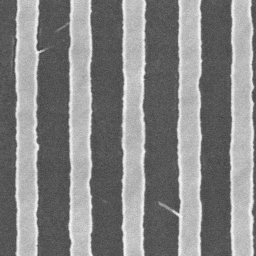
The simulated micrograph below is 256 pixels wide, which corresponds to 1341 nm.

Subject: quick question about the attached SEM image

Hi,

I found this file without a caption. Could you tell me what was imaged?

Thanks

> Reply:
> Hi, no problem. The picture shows lines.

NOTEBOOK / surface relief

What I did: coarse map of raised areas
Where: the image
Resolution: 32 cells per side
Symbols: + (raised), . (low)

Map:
..+++....++....+++....+++....++.
..+++....++....+++....+++....++.
..+++....++....+++....+++....++.
..+++....++....+++....+++....+++
..+++....++....+++....+++....+++
..+++....++....+++....+++....++.
..+++....++....+++....+++....+++
..+++....++....+++....+++....+++
..+++....++....+++....+++....+++
..+++....++....+++....+++....+++
..+++....++....+++....+++....+++
..+++....++....+++....+++....+++
..++.....++....+++....+++....+++
..+++....++....+++....+++....+++
..+++....++....+++....+++....+++
..+++....++....+++....+++....+++
..++.....++....+++....+++....+++
..+++....++....+++....+++....+++
..+++....++....+++....+++....+++
..+++....++....+++....+++....+++
..+++....++....+++....+++....+++
..+++....++....+++....+++....+++
..+++....++....+++....+++....+++
..+++....++....+++....+++....+++
..+++....++....+++....+++....+++
..+++....++....+++.....++....+++
..+++....++....+++....+++....++.
..+++....++....+++....+++....+++
..+++....++....+++....+++....+++
..+++....++....+++....+++....+++
..+++....++....+++....+++....+++
..+++....++....+++....+++....+++